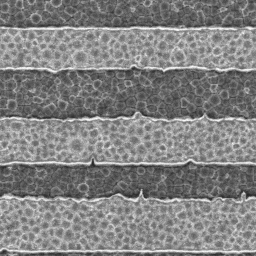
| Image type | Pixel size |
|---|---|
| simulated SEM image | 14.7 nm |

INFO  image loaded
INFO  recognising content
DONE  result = one or a few lines or trenches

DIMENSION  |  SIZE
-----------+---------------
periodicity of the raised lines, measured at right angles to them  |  1.3 um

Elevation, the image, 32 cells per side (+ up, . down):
................................
................................
................................
................................
++++++++++++++++++++++++++++++++
++++++++++++++++++++++++++++++++
++++++++++++++++++++++++++++++++
++++++++++++++++++++++++++++++++
+++.+++++++++..+.+..+....+++++++
................................
................................
................................
................................
................................
.................+..............
++++++++++++++++++++++++++++++++
++++++++++++++++++++++++++++++++
++++++++++++++++++++++++++++++++
++++++++++++++++++++++++++++++++
++++++++++++++++++++++++++++++++
.....................+..........
................................
................................
................................
..............+..+..............
++++++++++++++++++++++++++++++++
++++++++++++++++++++++++++++++++
++++++++++++++++++++++++++++++++
++++++++++++++++++++++++++++++++
++++++++++++++++++++++++++++++++
++++++++++++++++++++++++++++++++
................................